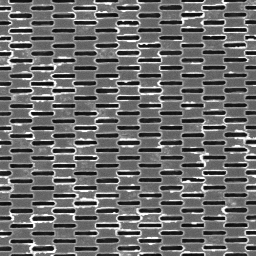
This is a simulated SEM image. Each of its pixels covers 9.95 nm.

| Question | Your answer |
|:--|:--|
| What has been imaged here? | a regular array of holes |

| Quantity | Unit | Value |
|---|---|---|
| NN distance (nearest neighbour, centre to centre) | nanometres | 146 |